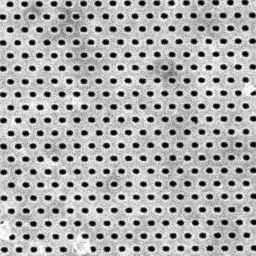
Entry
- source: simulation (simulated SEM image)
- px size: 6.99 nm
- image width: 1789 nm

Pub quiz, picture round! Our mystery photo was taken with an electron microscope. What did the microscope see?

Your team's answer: a regular array of holes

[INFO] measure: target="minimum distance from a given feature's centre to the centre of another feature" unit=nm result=100